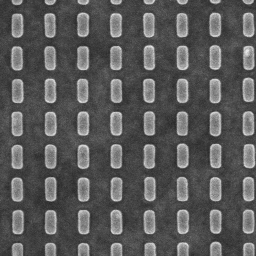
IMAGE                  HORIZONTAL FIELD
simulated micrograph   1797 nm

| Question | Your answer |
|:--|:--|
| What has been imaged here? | a regular array of raised bodies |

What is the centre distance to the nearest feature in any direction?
0.228 um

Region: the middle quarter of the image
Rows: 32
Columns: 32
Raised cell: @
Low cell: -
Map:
----@@------@@------@@------@@@-
--------------------------------
--------------------------------
--------------------------------
----@@------@@------@@------@@@-
----@@------@@------@@------@@@-
----@@------@@------@@------@@@-
----@@------@@------@@------@@@-
----@@------@@------@@------@@@-
----@@------@@-------@-------@--
--------------------------------
--------------------------------
----@@------@@------@@------@@@-
----@@------@@------@@@-----@@@-
----@@------@@------@@------@@@-
----@@------@@------@@------@@@-
----@@------@@------@@------@@@-
----@@------@@------@@-------@--
--------------------------------
--------------------------------
----@@------@@------@@-------@@-
----@@------@@------@@@-----@@@-
----@@------@@------@@@-----@@@-
----@@------@@------@@@-----@@@-
----@@------@@------@@@-----@@@-
----@@------@@------@@@------@@-
--------------------------------
--------------------------------
------------@@-------@-------@--
----@@------@@------@@@-----@@@-
----@@------@@------@@@-----@@@-
----@@------@@------@@@-----@@@-